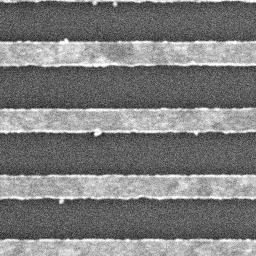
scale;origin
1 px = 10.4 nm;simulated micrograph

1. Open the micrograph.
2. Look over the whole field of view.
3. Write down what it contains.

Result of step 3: lines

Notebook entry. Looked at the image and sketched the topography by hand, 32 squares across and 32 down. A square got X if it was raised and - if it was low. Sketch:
--------------------------------
--------------------------------
--------------------------------
--------------------------------
--------------------------------
XXXXXXXXXXXXXXXXXXXXXXXXXXXXXXXX
XXXXXXXXXXXXXXXXXXXXXXXXXXXXXXXX
XXXXXXXXXXXXXXXXXXXXXXXXXXXXXXXX
--------------------------------
--------------------------------
--------------------------------
--------------------------------
--------------------------------
--------------------------------
XXXXXXXXXXXXXXXXXXXXXXXXXXXXXXXX
XXXXXXXXXXXXXXXXXXXXXXXXXXXXXXXX
-----------XX-------------------
--------------------------------
--------------------------------
--------------------------------
--------------------------------
--------------------------------
XXXXXXXXXXXXXXXXXXXXXXXXXXXXXXXX
XXXXXXXXXXXXXXXXXXXXXXXXXXXXXXXX
XXXXXXXXXXXXXXXXXXXXXXXXXXXXXXXX
--------------------------------
--------------------------------
--------------------------------
--------------------------------
--------------------------------
XXXXXXXXXXXXXXXXXXXXXXXXXXXXXXXX
XXXXXXXXXXXXXXXXXXXXXXXXXXXXXXXX